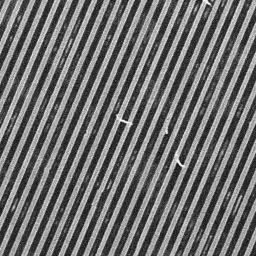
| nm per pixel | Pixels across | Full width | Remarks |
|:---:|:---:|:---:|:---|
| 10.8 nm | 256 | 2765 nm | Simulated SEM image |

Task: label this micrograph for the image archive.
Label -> parallel lines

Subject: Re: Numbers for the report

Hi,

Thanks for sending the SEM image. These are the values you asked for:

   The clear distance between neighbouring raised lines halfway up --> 0.0709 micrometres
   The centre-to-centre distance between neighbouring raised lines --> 0.123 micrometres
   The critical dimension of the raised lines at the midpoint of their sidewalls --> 0.0497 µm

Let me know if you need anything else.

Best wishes